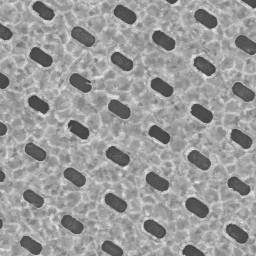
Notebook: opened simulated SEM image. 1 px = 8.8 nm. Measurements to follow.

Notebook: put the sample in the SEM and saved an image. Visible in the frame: a regular array of holes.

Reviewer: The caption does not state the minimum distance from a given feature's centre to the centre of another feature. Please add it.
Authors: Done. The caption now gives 410 nanometers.